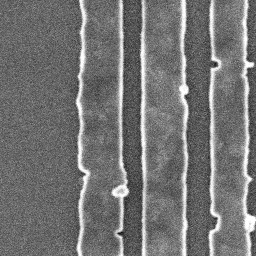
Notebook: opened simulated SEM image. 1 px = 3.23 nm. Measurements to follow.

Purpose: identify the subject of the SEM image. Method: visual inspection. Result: one or a few lines or trenches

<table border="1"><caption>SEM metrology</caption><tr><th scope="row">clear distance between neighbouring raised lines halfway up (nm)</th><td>70.6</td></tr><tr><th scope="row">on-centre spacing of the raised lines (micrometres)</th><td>0.207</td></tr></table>